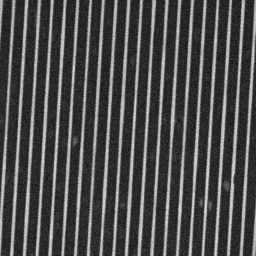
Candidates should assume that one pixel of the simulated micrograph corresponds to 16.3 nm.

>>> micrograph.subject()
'parallel lines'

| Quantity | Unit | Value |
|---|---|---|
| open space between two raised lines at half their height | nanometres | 169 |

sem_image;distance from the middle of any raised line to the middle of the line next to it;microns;0.207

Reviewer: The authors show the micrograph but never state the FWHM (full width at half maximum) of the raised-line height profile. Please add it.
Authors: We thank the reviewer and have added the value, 40.7 nanometers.